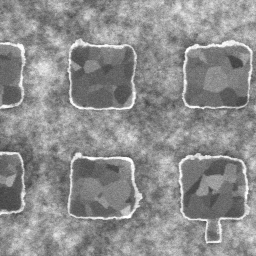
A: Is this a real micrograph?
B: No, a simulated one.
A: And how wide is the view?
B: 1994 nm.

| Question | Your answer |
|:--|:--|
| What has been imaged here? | raised bodies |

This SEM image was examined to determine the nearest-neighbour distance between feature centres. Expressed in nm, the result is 867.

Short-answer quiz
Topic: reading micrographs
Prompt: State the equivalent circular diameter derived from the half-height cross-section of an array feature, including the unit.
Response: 567 nm